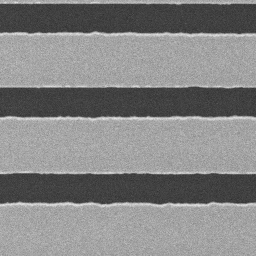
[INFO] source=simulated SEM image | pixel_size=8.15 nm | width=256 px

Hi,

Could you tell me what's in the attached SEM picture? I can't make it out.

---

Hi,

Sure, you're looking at lines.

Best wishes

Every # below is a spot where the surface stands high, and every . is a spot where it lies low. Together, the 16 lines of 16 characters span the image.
................
................
################
################
################
................
................
################
################
################
################
................
................
################
################
################